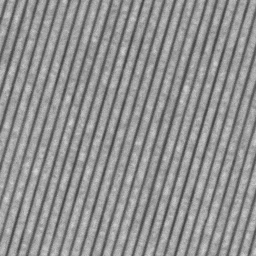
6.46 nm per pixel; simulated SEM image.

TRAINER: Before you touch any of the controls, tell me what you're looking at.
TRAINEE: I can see parallel lines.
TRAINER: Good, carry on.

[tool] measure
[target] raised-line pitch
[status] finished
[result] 0.0653 µm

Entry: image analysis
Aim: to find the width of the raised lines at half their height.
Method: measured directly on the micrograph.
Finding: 42.6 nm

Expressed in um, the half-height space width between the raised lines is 0.0186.